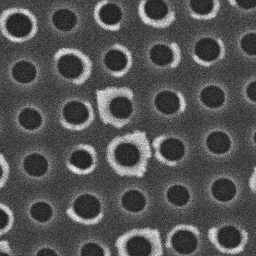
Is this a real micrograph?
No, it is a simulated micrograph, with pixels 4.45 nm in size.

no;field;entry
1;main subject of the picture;a regular array of holes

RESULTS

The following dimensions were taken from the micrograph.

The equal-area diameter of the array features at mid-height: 24.9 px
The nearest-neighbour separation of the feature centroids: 204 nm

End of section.